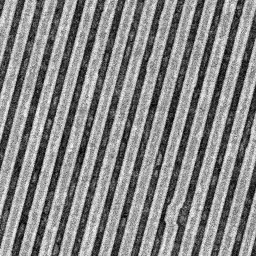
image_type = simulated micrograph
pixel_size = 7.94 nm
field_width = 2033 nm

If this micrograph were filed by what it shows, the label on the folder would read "parallel lines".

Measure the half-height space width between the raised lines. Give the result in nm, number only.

86.4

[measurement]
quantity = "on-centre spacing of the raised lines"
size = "154 nm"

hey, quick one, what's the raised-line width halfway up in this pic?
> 71.1 nanometres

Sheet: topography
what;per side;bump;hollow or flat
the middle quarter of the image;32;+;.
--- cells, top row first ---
.+++..+++...++..+++..+++..+++..+
.++...++...+++..++...++...++...+
.++...++...++...++...++...++...+
.++...++...++...++...++...++...+
+++..+++...++..+++..++...+++..++
++...++...+++..++...++...++...++
++...++...++...++...++...++...++
++...++...++...++..+++...++...++
++..+++..+++..+++..++...+++..+++
+...++...++...++...++...++...++.
+...++...++...++...++...++...++.
+...++...++...++..+++...++...++.
...+++..+++..+++..++...+++..+++.
...++...++...++...++...++...++..
...++...++...++...++...++...++..
...++..+++...++..+++..+++...++..
..+++..+++..++...++...++...+++..
..++...++...++...++...++...++...
..++...++...++...++...++...++...
.+++..+++..+++..+++..+++...++..+
.++...+++..++...++...++...++...+
.++...++...++...++...++...++...+
.++...++...++...++...++...++...+
+++...++..+++..+++..+++..+++..++
++...+++..++...++...++...++...++
++...++...++...++...++...++...++
++...++...++..+++...++...++...++
++..+++..+++..++...+++..+++..+++
+...++...++...++...++...++...++.
+...++...++...++...++...++...++.
+..+++...++..+++...++...++..+++.
+..+++..+++..++...+++..++...++..